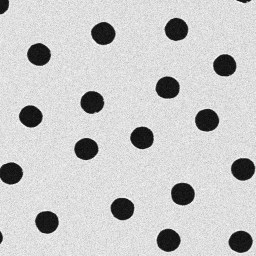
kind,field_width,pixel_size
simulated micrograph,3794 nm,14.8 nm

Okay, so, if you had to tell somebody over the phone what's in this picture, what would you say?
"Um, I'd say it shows a regular array of holes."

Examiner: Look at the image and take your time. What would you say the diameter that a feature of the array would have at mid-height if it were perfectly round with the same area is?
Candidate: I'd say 346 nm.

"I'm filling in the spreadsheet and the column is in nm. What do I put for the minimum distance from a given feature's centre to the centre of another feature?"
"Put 844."